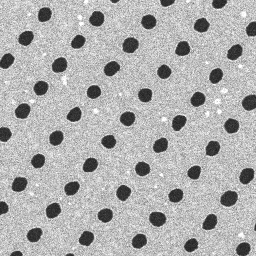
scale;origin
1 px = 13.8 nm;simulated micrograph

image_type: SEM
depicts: a regular array of holes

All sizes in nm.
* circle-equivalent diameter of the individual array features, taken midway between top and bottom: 207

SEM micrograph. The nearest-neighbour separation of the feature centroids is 409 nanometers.